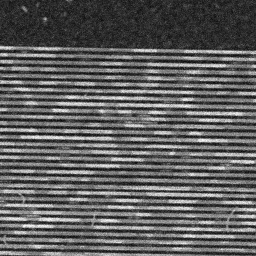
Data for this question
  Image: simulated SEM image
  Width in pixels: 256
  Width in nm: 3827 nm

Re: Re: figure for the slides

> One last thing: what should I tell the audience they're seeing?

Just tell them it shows parallel lines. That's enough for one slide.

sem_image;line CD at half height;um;0.0374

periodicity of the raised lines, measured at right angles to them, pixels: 6.82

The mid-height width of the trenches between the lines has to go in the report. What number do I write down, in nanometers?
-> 65.4